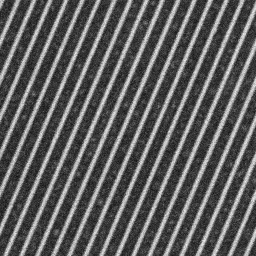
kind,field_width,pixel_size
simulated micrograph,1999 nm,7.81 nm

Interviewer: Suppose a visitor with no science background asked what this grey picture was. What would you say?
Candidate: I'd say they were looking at parallel lines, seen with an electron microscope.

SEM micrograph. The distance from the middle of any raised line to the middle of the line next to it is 115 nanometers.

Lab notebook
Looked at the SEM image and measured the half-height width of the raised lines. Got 28.7 nanometres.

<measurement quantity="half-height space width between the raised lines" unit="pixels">11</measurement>